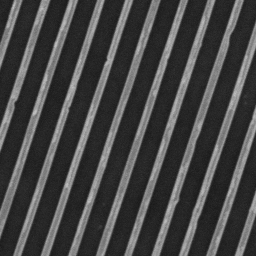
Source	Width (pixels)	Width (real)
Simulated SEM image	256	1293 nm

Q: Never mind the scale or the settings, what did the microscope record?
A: parallel lines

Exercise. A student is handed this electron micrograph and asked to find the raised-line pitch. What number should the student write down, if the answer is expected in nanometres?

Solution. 133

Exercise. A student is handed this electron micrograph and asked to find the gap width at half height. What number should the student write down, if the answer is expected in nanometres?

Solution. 96.6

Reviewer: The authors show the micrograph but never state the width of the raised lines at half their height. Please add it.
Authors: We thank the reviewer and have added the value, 6.42 px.